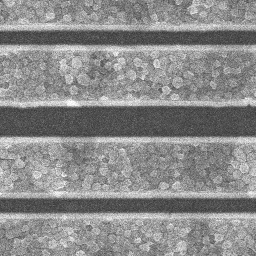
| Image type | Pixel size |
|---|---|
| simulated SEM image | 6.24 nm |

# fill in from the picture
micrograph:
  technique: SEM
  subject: one or a few lines or trenches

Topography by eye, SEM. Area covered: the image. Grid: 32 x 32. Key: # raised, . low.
################################
################################
################################
.....................##.##......
................................
................................
################################
################################
################################
################################
################################
################################
################################
................................
................................
................................
................................
......##..###...................
################################
################################
################################
################################
################################
################################
................................
................................
................................
################################
################################
################################
################################
################################